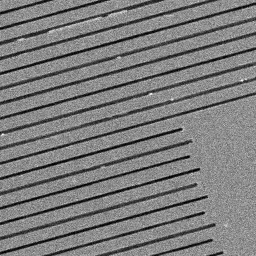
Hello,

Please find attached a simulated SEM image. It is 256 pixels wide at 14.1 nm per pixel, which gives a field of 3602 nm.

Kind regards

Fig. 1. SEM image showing parallel lines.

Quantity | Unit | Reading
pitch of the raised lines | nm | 204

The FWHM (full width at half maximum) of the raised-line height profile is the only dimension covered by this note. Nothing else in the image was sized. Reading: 153 nanometres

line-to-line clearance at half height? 42.4 nm